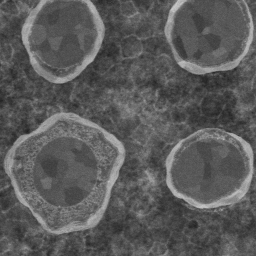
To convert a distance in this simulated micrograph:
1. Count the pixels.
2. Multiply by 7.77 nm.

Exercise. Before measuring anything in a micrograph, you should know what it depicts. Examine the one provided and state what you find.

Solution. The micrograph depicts raised bodies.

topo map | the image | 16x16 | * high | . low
..****.....****.
..****.....*****
..****.....*****
..****.....****.
...**...........
................
................
...**...........
..*****.....***.
.*******...*****
.******....*****
.******....****.
.******.....**..
..****..........
...*............
................